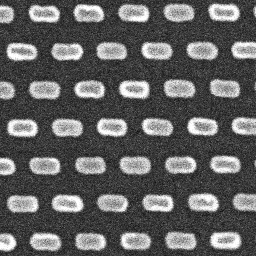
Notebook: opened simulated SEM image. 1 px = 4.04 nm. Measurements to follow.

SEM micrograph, a regular array of raised bodies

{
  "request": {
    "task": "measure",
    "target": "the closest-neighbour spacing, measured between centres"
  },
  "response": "178 nanometres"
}